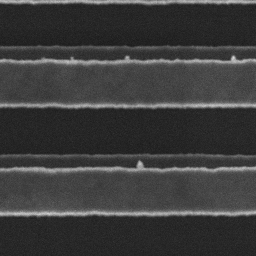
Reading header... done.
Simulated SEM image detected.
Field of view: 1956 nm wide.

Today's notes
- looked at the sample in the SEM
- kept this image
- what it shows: lines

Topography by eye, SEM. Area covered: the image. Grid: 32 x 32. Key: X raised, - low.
--------------------------------
--------------------------------
--------------------------------
--------------------------------
--------------------------------
--------------------------------
--------------------------------
XX---XX-XX-----XX--XX-X-X----XXX
XXXXXXXXXXXXXXXXXXXXXXXXXXXXXXXX
XXXXXXXXXXXXXXXXXXXXXXXXXXXXXXXX
XXXXXXXXXXXXXXXXXXXXXXXXXXXXXXXX
XXXXXXXXXXXXXXXXXXXXXXXXXXXXXXXX
XXXXXXXXXXXXXXXXXXXXXXXXXXXXXXXX
--------------------------------
--------------------------------
--------------------------------
--------------------------------
--------------------------------
--------------------------------
--------------------------------
-----------------X--------------
XXXXXXXXXXXXXXXXXXXXXXXXXXXXXXXX
XXXXXXXXXXXXXXXXXXXXXXXXXXXXXXXX
XXXXXXXXXXXXXXXXXXXXXXXXXXXXXXXX
XXXXXXXXXXXXXXXXXXXXXXXXXXXXXXXX
XXXXXXXXXXXXXXXXXXXXXXXXXXXXXXXX
XXXXXXXXXXXXXXXXXXXXXXXXXXXXXXXX
--------------------------------
--------------------------------
--------------------------------
--------------------------------
--------------------------------